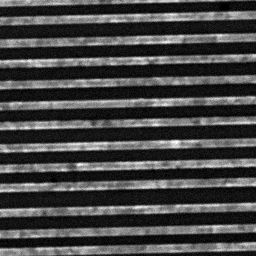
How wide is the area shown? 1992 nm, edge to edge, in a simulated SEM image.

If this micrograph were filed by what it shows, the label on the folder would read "parallel lines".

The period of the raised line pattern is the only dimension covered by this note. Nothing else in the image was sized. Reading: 164 nm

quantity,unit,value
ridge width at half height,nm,55.4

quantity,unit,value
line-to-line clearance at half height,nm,111